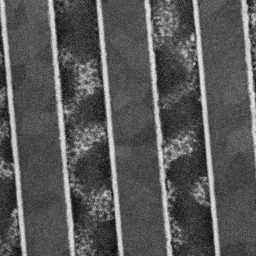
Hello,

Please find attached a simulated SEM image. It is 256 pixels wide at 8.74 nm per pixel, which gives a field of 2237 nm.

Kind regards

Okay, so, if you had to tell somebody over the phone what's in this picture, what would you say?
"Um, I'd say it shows one or a few lines or trenches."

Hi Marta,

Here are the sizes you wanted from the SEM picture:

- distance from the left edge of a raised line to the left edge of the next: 842 nanometers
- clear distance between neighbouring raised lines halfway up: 417 nanometres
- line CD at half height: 424 nanometres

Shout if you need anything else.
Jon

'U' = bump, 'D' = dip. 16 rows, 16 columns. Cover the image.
UUUDDDUUUDDDUUUD
UUUDDDUUUDDDUUUD
UUUDDDUUUDDDUUUD
UUUDDDUUUUDDUUUU
UUUUDDDUUUDDDUUU
DUUUDDDUUUDDDUUU
DUUUDDDUUUDDDUUU
DUUUDDDUUUDDDUUU
DUUUDDDUUUDDDUUU
DUUUDDDUUUDDDUUU
DUUUDDDUUUDDDUUU
DUUUDDDUUUDDDUUU
DUUUDDDUUUDDDUUU
DUUUDDDUUUDDDUUU
DUUUDDDUUUUDDUUU
DUUUUDDDUUUDDDUU